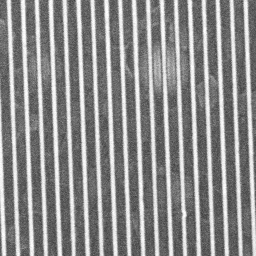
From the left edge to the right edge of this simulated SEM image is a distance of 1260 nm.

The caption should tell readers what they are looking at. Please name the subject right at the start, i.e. parallel lines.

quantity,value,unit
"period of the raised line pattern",68.4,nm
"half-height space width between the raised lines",54.7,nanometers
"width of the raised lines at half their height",12.3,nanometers